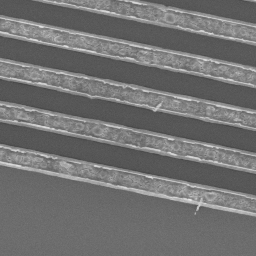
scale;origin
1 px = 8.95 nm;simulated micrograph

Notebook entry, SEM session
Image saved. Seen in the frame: parallel lines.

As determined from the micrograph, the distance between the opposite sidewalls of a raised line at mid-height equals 162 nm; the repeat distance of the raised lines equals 42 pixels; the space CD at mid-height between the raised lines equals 215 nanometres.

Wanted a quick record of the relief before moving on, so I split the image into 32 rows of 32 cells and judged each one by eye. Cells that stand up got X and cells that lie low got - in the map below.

-------XXXXXXXXXXXX-------------
------------XXXXXXXXXXXX--------
XX---------------XXXXXXXXXXXX---
XXXXXXX---------------XXXXXXXXXX
-XXXXXXXXXXX---------------XXXXX
------XXXXXXXXXXX---------------
----------XXXXXXXXXXXX----------
----------------XXXXXXXXXXX-----
XXXXX---------------XXXXXXXXXXX-
XXXXXXXXXXX--------------XXXXXXX
----XXXXXXXXXXX---------------XX
---------XXXXXXXXXXX------------
--------------XXXXXXXXXXX-------
XXXX---------------XXXXXXXXXXX--
XXXXXXXX---------------XXXXXXXXX
--XXXXXXXXXXXX--------------XXXX
-------XXXXXXXXXXX--------------
------------XXXXXXXXXXX---------
XX---------------XXXXXXXXXXXX---
XXXXXXX---------------XXXXXXXXXX
-XXXXXXXXXXX---------------XXXXX
-----XXXXXXXXXXXX---------------
----------XXXXXXXXXXX-----------
---------------XXXXXXXXXXXX-----
--------------------XXXXXXXXXXX-
-------------------------XXXXXXX
------------------------------XX
--------------------------------
--------------------------------
--------------------------------
--------------------------------
--------------------------------